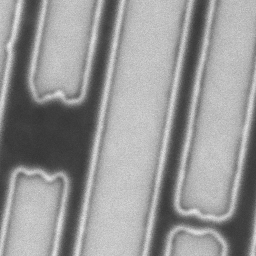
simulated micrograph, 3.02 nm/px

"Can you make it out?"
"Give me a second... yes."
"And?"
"one or a few lines or trenches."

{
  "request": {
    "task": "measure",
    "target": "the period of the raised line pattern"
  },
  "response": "262 nanometers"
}